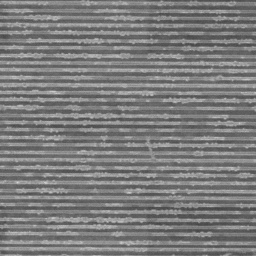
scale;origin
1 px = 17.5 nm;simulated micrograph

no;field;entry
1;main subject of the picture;parallel lines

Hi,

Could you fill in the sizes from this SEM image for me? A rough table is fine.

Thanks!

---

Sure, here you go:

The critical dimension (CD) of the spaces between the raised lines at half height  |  83 nm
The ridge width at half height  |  52.4 nanometers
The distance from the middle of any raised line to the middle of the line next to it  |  130 nanometers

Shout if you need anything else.